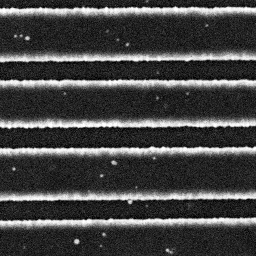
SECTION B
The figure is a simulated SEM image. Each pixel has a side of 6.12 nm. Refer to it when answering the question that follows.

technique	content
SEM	lines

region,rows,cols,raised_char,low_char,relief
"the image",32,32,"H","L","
LLLLLLLLLLLLLLLLLLLLLLLLLLLLLLLL
HHHHHHHHHHHHHHHHHHHHHHHHHHHHHHHH
HHHHHHHHHHHHHHHHHHHHHHHHHHHHHHHH
HHHHHHHHHHHHHHHHHHHHHHHHHHHHHHHH
HHHHHHHHHHHHHHHHHHHHHHHHHHHHHHHH
HHHHHHHHHHHHHHHHHHHHHHHHHHHHHHHH
HHHHHHHHHHHHHHHHHHHHHHHHHHHHHHHH
LLLLLLLLLLLLLLLLLLLLLLLLLLLLLLLL
LLLLLLLLLLLLLLLLLLLLLLLLLLLLLLLL
LLLLLLLLLLLLLLLLLLLLLLLLLLLLLLLL
HHHHHHHHHHHHHHHHHHHHHHHHHHHHHHHH
HHHHHHHHHHHHHHHHHHHHHHHHHHHHHHHH
HHHHHHHHHHHHHHHHHHHHHHHHHHHHHHHH
HHHHHHHHHHHHHHHHHHHHHHHHHHHHHHHH
HHHHHHHHHHHHHHHHHHHHHHHHHHHHHHHH
HHHHHHHHHHHHHHHHHHHHHHHHHHHHHHHH
LLLLLLLLLLLLLLLLLLLLLLLLLLLLLLLL
LLLLLLLLLLLLLLLLLLLLLLLLLLLLLLLL
LLLLLLLLLLLLLLLLLLLLLLLLLLLLLLLL
HHHHHHHHHHHHHHHHHHHHHHHHHHHHHHHH
HHHHHHHHHHHHHHHHHHHHHHHHHHHHHHHH
HHHHHHHHHHHHHHHHHHHHHHHHHHHHHHHH
HHHHHHHHHHHHHHHHHHHHHHHHHHHHHHHH
HHHHHHHHHHHHHHHHHHHHHHHHHHHHHHHH
HHHHHHHHHHHHHHHHHHHHHHHHHHHHHHHH
LLLLLLLLLLLLLLLLLLLLLLLLLLLLLLLL
LLLLLLLLLLLLLLLLLLLLLLLLLLLLLLLL
LLLLLLLLLLLLLLLLLLLLLLLLLLLLLLLH
HHHHHHHHHHHHHHHHHHHHHHHHHHHHHHHH
HHHHHHHHHHHHHHHHHHHHHHHHHHHHHHHH
HHHHHHHHHHHHHHHHHHHHHHHHHHHHHHHH
HHHHHHHHHHHHHHHHHHHHHHHHHHHHHHHH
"